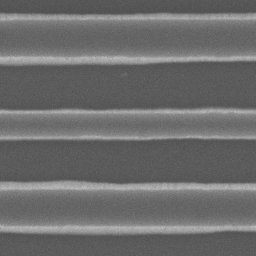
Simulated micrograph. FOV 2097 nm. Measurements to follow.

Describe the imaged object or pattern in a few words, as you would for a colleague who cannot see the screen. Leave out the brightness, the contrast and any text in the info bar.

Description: lines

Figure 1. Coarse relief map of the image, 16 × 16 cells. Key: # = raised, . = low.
................
################
################
################
................
................
................
################
################
................
................
................
################
################
................
................